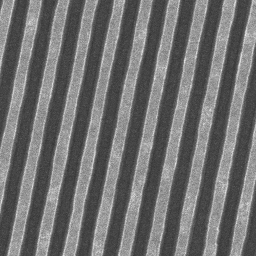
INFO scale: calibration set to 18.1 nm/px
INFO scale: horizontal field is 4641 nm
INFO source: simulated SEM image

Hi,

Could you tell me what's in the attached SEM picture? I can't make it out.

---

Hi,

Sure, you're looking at parallel lines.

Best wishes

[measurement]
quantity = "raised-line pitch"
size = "493 nanometers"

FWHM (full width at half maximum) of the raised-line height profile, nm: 242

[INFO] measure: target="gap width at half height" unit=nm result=258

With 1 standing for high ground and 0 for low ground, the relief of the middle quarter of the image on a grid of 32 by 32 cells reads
00111000011100001110000111000011
00111000011100001110000111000011
00111000011100011110001111000111
00111000011000011100001110000111
01111000111000011100001110000111
01110000111000011100001110000111
01110000111000011100001110000111
01110000111000111100011110000111
01110001110000111100011100001110
11100001110000111000011100001110
11100001110000111000011100001110
11100001110000111000011100001110
11100001110001111000111100011110
11100001110001111000111000011100
11100011100001110000111000011100
11000011100001110000111000011100
11000011100001110000111000011100
11000011100011110001111000111100
11000111100011110001110000111000
11000111000011100001110000111000
10000111000011100001110000111000
10000111000011100001110000111000
10000111000111100011110001111000
10001111000111100011110001110000
10001111000111000011100001110000
00001111000111000011100001110000
00001110000111000011100001110000
00001110001111000111100011110001
00011110001111000111100011100001
00011110001110000111000011100001
00011100001110000111000011100001
00011100001110000111000011100001